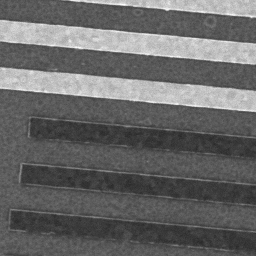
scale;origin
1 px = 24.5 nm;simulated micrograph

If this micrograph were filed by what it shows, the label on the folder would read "parallel lines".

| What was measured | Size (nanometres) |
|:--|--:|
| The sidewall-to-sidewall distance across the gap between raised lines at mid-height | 656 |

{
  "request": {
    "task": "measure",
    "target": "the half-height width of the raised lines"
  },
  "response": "0.494 microns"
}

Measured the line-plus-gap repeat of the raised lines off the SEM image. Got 1150 nm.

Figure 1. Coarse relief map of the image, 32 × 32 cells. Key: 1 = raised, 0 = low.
00000000000001111111111111111111
00000000000000000000000011111111
00000000000000000000000000100000
11111111110000000000000000000000
11111111111111111111100000000000
00000111111111111111111111111111
00000000000000001111111111111111
00000000000000000000000000011111
00000000000000000000000000000000
11111111111000000000000000000000
11111111111111111111110000000000
00000011111111111111111111111111
00000000000000000111111111111111
00000000000000000000000000001111
00000000000000000000000000000000
00001111111100000000000000000000
00001111111111111111111100000000
00000001111111111111111111111111
00000000000000000011111111111111
00000000000000000000000000000111
00010000000000000000000000000000
00011111111111000000000000000000
00111111111111111111111110000000
00000000111111111111111111111111
00000000000000000001111111111111
00000000000000000000000000000011
01110000000000000000000000000000
01111111111111110000000000000000
01111111111111111111111111000000
00000000011111111111111111111111
00000000000000000000111111111111
00000000000000000000000000000001